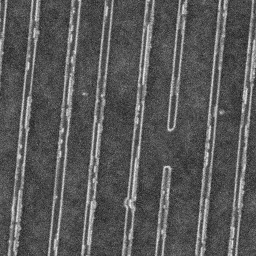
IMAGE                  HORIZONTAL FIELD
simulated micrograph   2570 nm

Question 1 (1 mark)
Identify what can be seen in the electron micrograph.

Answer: parallel lines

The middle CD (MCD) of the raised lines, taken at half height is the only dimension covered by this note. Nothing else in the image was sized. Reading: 79.9 nm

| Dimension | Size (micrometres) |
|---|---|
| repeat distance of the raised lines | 0.369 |